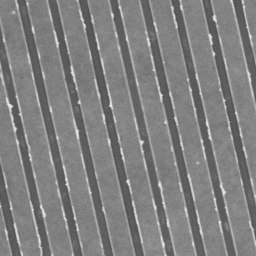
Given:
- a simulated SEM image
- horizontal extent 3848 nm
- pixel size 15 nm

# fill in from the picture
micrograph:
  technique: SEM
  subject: parallel lines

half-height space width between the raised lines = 132 nm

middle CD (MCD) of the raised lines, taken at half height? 325 nm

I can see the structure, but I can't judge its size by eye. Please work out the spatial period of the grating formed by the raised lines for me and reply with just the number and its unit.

0.452 micrometres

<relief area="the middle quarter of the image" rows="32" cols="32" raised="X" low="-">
--XXXXX---XXXXX--XXXXXX--XXXXX--
--XXXXXX--XXXXX--XXXXXX--XXXXXX-
--XXXXXX--XXXXX---XXXXX---XXXXX-
--XXXXXX--XXXXXX--XXXXX---XXXXX-
---XXXXX---XXXXX--XXXXXX--XXXXX-
X--XXXXX---XXXXX--XXXXXX--XXXXX-
X--XXXXXX--XXXXX---XXXXX--XXXXXX
X--XXXXXX--XXXXX---XXXXX--XXXXXX
X---XXXXX--XXXXXX--XXXXX---XXXXX
XX--XXXXX--XXXXXX--XXXXXX--XXXXX
XX--XXXXX---XXXXX--XXXXXX--XXXXX
XX--XXXXXX--XXXXX---XXXXX---XXXX
XX---XXXXX--XXXXXX--XXXXX---XXXX
XX---XXXXX--XXXXXX--XXXXXX--XXXX
XXX--XXXXX---XXXXX--XXXXXX--XXXX
XXX--XXXXX---XXXXX---XXXXX--XXXX
XXX--XXXXXX--XXXXX---XXXXX---XXX
XXXX--XXXXX--XXXXXX--XXXXX---XXX
XXXX--XXXXX--XXXXXX--XXXXXX--XXX
XXXX--XXXXXX--XXXXXX-XXXXXX--XXX
XXXX--XXXXXX--XXXXX---XXXXX--XXX
XXXX---XXXXX--XXXXXX--XXXXX--XXX
XXXX---XXXXX--XXXXXX--XXXXXX--XX
XXXXX--XXXXX---XXXXX--XXXXXX--XX
XXXXX--XXXXX---XXXXX---XXXXX--XX
XXXXX--XXXXXX--XXXXX---XXXXX--XX
XXXXX---XXXXX--XXXXXX--XXXXX---X
XXXXXX--XXXXX---XXXXX--XXXXXX--X
XXXXXX--XXXXXX--XXXXX--XXXXXX--X
-XXXXX--XXXXXX--XXXXX---XXXXX--X
-XXXXX---XXXXX--XXXXXX--XXXXX---
-XXXXX---XXXXX--XXXXXX--XXXXXX--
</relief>